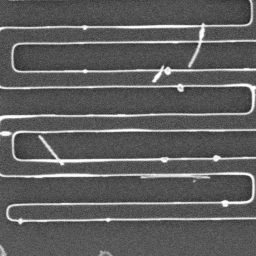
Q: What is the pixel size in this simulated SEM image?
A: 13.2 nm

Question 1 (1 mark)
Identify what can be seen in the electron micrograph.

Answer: groups of lines, slits or small figures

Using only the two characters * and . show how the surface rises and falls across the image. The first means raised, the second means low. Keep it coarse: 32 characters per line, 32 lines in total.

...............................*
...............................*
...............................*
.....***************************
********************************
***.............................
**..............................
**..............................
**..............................
********************************
********************************
................................
................................
................................
....****************************
********************************
*******.........................
**..............................
**..............................
**..............................
********************************
********************************
................................
................................
................................
...............*****************
.*******************************
..*********..*..................
................................
................................
................................
................................